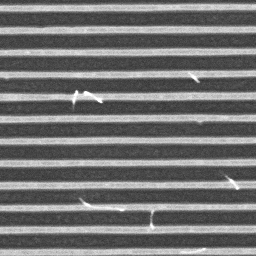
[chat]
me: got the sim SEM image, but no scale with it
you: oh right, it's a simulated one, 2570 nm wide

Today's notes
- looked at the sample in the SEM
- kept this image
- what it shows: parallel lines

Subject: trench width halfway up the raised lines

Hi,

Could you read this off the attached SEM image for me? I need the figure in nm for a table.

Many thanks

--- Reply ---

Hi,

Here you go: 143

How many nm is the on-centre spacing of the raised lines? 223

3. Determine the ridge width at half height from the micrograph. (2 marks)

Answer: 76.5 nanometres